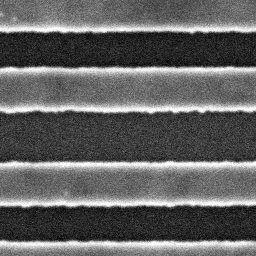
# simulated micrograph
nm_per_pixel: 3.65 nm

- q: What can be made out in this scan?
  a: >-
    lines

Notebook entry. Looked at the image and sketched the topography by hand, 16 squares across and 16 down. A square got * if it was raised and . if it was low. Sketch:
****************
****************
................
................
****************
****************
****************
................
................
................
****************
****************
****************
................
................
****************